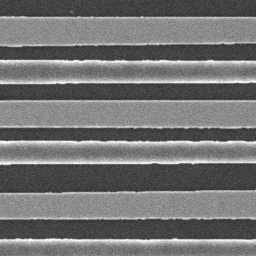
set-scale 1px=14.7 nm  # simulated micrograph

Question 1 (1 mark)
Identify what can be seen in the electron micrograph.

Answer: lines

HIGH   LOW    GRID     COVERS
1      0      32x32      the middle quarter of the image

11111111111111111111111111111111
11111111111111111111111111111111
11111111111111111111111111111111
11111111111111111111111111111111
11111111111111111111111111111111
00000000000000000000000000000000
00000000000000000000000000000000
00000000000000000000000000000000
00000000000000000000000000000000
11111111111111111111111111111111
11111111111111111111111111111111
11111111111111111111111111111111
11111111111111111111111111111111
11111111111111111111111111111111
11111111111111111111111111111111
11111111111111111111111111111111
00000000000000000000000000000000
00000000000000000000000000000000
00000000000000000000000000000000
11101111111111110111110001111111
11111111111111111111111111111111
11111111111111111111111111111111
11111111111111111111111111111111
11111111111111111111111111111111
11111111111111111111111111111111
00000000000000000000000000000000
00000000000000000000000000000000
00000000000000000000000000000000
00000000000000000000000000000000
00000000000000000000000000000000
00000000000000000000000000000000
00000000000000000000000000000000